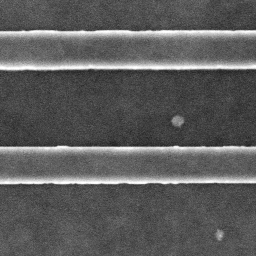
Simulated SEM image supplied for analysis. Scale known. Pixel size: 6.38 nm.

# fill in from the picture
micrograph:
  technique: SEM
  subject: lines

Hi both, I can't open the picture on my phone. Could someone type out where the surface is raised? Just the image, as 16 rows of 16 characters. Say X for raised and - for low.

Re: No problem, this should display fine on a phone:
----------------
----------------
XXXXXXXXXXXXXXXX
XXXXXXXXXXXXXXXX
----------------
----------------
----------------
----------------
----------------
XXXXXXXXXXXXXXXX
XXXXXXXXXXXXXXXX
----------------
----------------
----------------
----------------
----------------